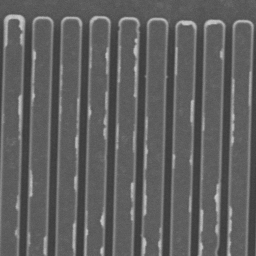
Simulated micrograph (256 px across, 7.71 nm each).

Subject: parallel lines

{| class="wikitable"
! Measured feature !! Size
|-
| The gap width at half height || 0.0713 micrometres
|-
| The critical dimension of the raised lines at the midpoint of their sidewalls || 151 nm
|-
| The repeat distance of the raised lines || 0.221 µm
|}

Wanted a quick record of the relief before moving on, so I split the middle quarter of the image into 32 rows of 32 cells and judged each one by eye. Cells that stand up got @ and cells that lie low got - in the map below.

@@@@--@@@@@---@@@@---@@@@---@@@@
@@@@--@@@@@---@@@@---@@@@---@@@@
@@@@--@@@@@---@@@@---@@@@---@@@@
@@@@--@@@@@---@@@@---@@@@---@@@@
@@@@--@@@@@---@@@@---@@@@---@@@@
@@@@--@@@@@---@@@@---@@@@---@@@@
@@@@--@@@@@---@@@@---@@@@---@@@@
@@@@--@@@@@---@@@@---@@@@---@@@@
@@@@--@@@@@--@@@@@---@@@@---@@@@
@@@@--@@@@@--@@@@@---@@@@---@@@@
@@@@--@@@@@--@@@@@---@@@@---@@@@
@@@@--@@@@@--@@@@@---@@@@---@@@@
@@@@--@@@@@--@@@@@---@@@@---@@@@
@@@@--@@@@@--@@@@@---@@@@---@@@@
@@@@--@@@@@--@@@@@---@@@@---@@@@
@@@@--@@@@@--@@@@@---@@@@---@@@@
@@@---@@@@@--@@@@@--@@@@@--@@@@@
@@@---@@@@@--@@@@@--@@@@@--@@@@@
@@@---@@@@@--@@@@@--@@@@@--@@@@@
@@@---@@@@@--@@@@@--@@@@@--@@@@@
@@@---@@@@@--@@@@@--@@@@@--@@@@@
@@@---@@@@@--@@@@@--@@@@@--@@@@@
@@@---@@@@@--@@@@@--@@@@@--@@@@@
@@@---@@@@---@@@@@--@@@@@--@@@@@
@@@---@@@@@--@@@@@--@@@@@--@@@@@
@@@---@@@@---@@@@@--@@@@@--@@@@@
@@@---@@@@---@@@@@--@@@@@--@@@@@
@@@---@@@@---@@@@@--@@@@@--@@@@@
@@@---@@@@---@@@@@--@@@@@--@@@@@
@@@---@@@@---@@@@@--@@@@@--@@@@@
@@@---@@@@---@@@@@--@@@@@--@@@@@
@@@---@@@@---@@@@@--@@@@@--@@@@@